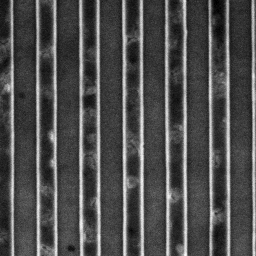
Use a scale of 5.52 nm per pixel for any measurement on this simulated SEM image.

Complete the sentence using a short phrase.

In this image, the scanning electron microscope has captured parallel lines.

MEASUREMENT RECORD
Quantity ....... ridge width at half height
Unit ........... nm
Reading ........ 104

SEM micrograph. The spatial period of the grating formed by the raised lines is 238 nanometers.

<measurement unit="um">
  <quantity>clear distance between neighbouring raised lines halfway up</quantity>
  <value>0.131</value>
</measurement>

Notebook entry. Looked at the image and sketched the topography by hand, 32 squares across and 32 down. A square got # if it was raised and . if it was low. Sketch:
#....##...##...###...##...##....
##...##...##...###...##...##....
##...##...##...###...##...##....
##...##...##...###...##...##....
##...##...##...###...##...##....
##...##...##...###...##...##....
##...##...##...###...##...##....
##...##...##...###...##...##....
##...##...##...###...##...##....
##...##...##...###...##...##....
##...##...##...###...##...##....
##...##...##...###...##...##....
##...##...##...###...##...###...
##...##...##...###...##...###...
##...##...##...###...##...###...
##...##...##...###...##...###...
##...##...##...###...##...###...
##...##...##...###...##...###...
##...##...##...###...##...###...
##...##...##...###...##...###...
##...##...##...###...##...###...
##...##...##...###...##...###...
##...##...##...###...##...###...
##...##...##...###...##...###...
##...##...##....##...##...###...
##...##...##....##...##...###...
##...##...##....##...##...###...
##...##...##....##...##...###...
##...##...##....##...##...###...
##...##...##....##...##...###...
##...##...##....##...##...###...
##...##...##....##...##...###...